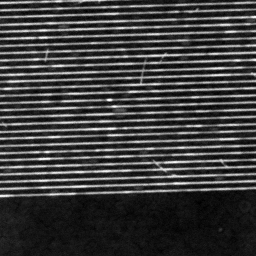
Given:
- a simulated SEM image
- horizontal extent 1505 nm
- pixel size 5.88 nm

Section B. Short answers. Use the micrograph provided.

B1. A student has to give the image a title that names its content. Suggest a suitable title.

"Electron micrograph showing parallel lines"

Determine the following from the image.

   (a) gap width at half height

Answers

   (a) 33.1 nanometres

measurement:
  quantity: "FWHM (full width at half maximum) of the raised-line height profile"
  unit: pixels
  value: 1.38